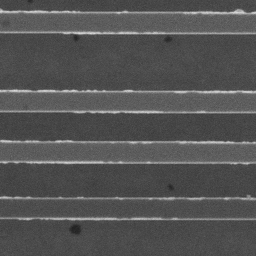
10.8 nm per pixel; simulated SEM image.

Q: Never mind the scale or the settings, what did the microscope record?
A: lines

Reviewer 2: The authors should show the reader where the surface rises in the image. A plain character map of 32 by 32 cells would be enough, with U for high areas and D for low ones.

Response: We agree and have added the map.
DDDDDDDDDDDDDDDDDDDDDDDDDDDDDDDD
UUUUUUDDUDDDDDDUDDDDDDDDDDDDDDDD
UUUUUUUUUUUUUUUUUUUUUUUUUUUUUUUU
UUUUUUUUUUUUUUUUUUUUUUUUUUUUUUUU
DDDDDDDDDDDDDDDDDDDDDDDDDDDDDDDD
DDDDDDDDDDDDDDDDDDDDDDDDDDDDDDDD
DDDDDDDDDDDDDDDDDDDDDDDDDDDDDDDD
DDDDDDDDDDDDDDDDDDDDDDDDDDDDDDDD
DDDDDDDDDDDDDDDDDDDDDDDDDDDDDDDD
DDDDDDDDDDDDDDDDDDDDDDDDDDDDDDDD
DDDDDDDDDDDDDDDDDDDDDDDDDDDDDDDD
UUUUUUUUUUUUUUUUUUUUUUUUUUUUUUUU
UUUUUUUUUUUUUUUUUUUUUUUUUUUUUUUU
UUUUUUUUUUUUUUUUUUUUUUUUUUUUUUUU
DDDDDDDDDDDDDDDDDDDDDDDDDDDDDDDD
DDDDDDDDDDDDDDDDDDDDDDDDDDDDDDDD
DDDDDDDDDDDDDDDDDDDDDDDDDDDDDDDD
DDDDDDDDDDDDDDDDDDDDDDDDDDDDDDDD
UUUUUUUUUUUUUUUUUUUUUUUUUUUUUUUU
UUUUUUUUUUUUUUUUUUUUUUUUUUUUUUUU
DDDDDDDDDDDDDDDDDDDDDDDDDDDDDDDD
DDDDDDDDDDDDDDDDDDDDDDDDDDDDDDDD
DDDDDDDDDDDDDDDDDDDDDDDDDDDDDDDD
DDDDDDDDDDDDDDDDDDDDDDDDDDDDDDDD
DDDDDDDDDDDDDDDDDDDDDDDDDDDDDDDD
UUUUUUUUUUUUUUUUUUUUUUUUUUUUUUUU
UUUUUUUUUUUUUUUUUUUUUUUUUUUUUUUU
DDDDDDDDDDDDDDDDDDDDDDDDDDDDDDDD
DDDDDDDDDDDDDDDDDDDDDDDDDDDDDDDD
DDDDDDDDDDDDDDDDDDDDDDDDDDDDDDDD
DDDDDDDDDDDDDDDDDDDDDDDDDDDDDDDD
DDDDDDDDDDDDDDDDDDDDDDDDDDDDDDDD